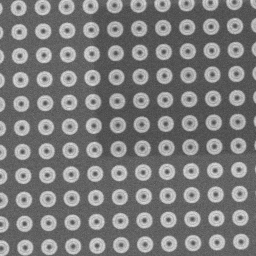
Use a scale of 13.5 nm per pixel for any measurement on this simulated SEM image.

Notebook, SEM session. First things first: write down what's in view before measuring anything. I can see an array of small figures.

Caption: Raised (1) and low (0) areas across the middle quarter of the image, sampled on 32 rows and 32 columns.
00000000000000000000000000000000
00000000000001000011000011000011
11100111100111100111100111100111
11100111100111100111100111100111
11100111100011100011000011000011
11000000000000000000000000000000
00000000000000000000000000000000
00000000000001000011000011100011
11100011100011100111100111100111
11100111100111100111100111100111
11100011100011100011100011100011
00000000000000000000000000000000
00000000000000000000000000000000
00000000000001000011100011100011
11100011100011100011100011100011
11100011100011100011100011100011
11100011100011100011100011100011
01000000000000000000000000000000
00000000000000000000000000000000
00000000000001000011100011100011
11100011100011100011100011110011
11100011100011110011100011110011
11100011100011100011100011100001
00000000000000000000000000000000
00000000000000000000000000000000
00000000000001100001100011100011
11100011100011110011110011110011
11110011110011110011110011110011
11110011100011100011100011100001
01000000000000000000000000000000
00000000000000000000000000000000
00000000000001100001100001100011